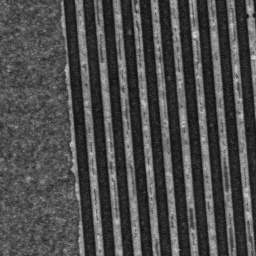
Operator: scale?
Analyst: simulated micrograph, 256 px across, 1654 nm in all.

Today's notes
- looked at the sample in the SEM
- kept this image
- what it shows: parallel lines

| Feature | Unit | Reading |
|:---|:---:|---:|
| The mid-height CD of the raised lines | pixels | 5.98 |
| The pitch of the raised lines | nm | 122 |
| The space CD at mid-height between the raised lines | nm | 82.1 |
